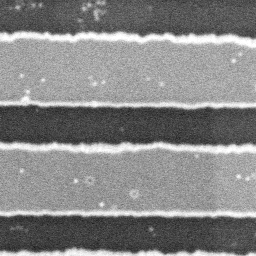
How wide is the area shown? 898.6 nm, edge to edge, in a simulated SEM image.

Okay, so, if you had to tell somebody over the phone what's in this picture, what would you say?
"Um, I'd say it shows lines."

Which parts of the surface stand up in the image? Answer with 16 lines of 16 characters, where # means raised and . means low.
................
................
################
################
################
################
################
................
................
################
################
################
################
........#.######
................
................